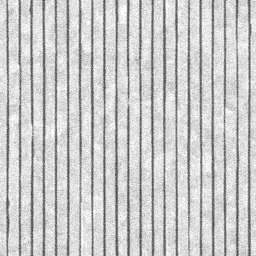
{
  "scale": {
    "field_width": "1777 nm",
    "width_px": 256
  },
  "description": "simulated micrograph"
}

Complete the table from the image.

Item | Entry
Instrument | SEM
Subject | parallel lines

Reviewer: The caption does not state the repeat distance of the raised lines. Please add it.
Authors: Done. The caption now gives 83.7 nanometres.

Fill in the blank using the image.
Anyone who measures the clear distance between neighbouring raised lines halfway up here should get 18.2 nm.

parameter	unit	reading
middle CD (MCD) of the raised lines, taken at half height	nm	61.6